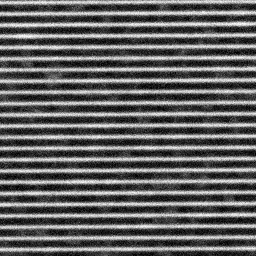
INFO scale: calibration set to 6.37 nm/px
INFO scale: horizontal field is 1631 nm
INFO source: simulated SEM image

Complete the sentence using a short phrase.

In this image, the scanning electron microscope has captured parallel lines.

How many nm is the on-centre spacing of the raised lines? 71.5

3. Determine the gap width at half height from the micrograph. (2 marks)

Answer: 0.0573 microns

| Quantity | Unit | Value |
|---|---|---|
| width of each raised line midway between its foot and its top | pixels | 2.24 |